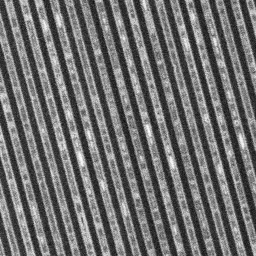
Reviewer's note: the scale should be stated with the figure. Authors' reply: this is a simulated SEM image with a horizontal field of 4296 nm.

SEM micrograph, parallel lines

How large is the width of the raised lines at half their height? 105 nanometres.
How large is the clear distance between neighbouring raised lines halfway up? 136 nm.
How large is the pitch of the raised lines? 14.6 px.